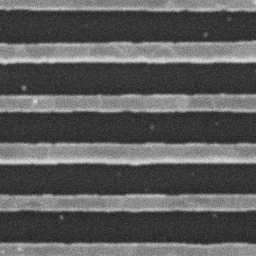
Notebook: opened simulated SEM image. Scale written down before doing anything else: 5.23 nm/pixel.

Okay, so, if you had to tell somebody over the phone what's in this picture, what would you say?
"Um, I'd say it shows lines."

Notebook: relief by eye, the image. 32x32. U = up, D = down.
UUUUUUUUUUUUUUUUUUUUUUUUUUUUUUUU
DDDDDDDDDDDDDDDDDDDDDDDDDDDDDDDD
DDDDDDDDDDDDDDDDDDDDDDDDDDDDDDDD
DDDDDDDDDDDDDDDDDDDDDDDDDDDDDDDD
DDDDDDDDDDDDDDDDDDDDDDDDDDDDDDDD
DDDDDDDDDDDDDUUUUUUUUUUUUUUUUUUU
UUUUUUUUUUUUUUUUUUUUUUUUUUUUUUUU
UUUUUUUUUUUUUUUUUUUUUUUUUUUUUUUU
DDDDDDDDDDDDDDDDDDDDDDDDDDDDDDDD
DDDDDDDDDDDDDDDDDDDDDDDDDDDDDDDD
DDDDDDDDDDDDDDDDDDDDDDDDDDDDDDDD
DDDDDDDDDDDDDDDDDDDDDDDDDDDDDDDD
UUUUUUUUUUUUUUUUUUUUUUUUUUUUUUUU
UUUUUUUUUUUUUUUUUUUUUUUUUUUUUUUU
DDDDDDDDDDDDDDDDDDDDDDDDDDDDDDDD
DDDDDDDDDDDDDDDDDDDDDDDDDDDDDDDD
DDDDDDDDDDDDDDDDDDDDDDDDDDDDDDDD
DDDDDDDDDDDDDDDDDDDDDDDDDDDDDDDD
UUUUUUUUUUUUUUUUUUUUUUUUUUUUUUUU
UUUUUUUUUUUUUUUUUUUUUUUUUUUUUUUU
DDDDDDDDDDDDDDDDDDDDDDDDDDDDDDDD
DDDDDDDDDDDDDDDDDDDDDDDDDDDDDDDD
DDDDDDDDDDDDDDDDDDDDDDDDDDDDDDDD
DDDDDDDDDDDDDDDDDDDDDDDDDDDDDDDD
UDDDDUUDDUUDDDDUUUUUUDUUUUUUUUUU
UUUUUUUUUUUUUUUUUUUUUUUUUUUUUUUU
DDDDDDDDDDDDDDDDDDDDDDDDDDDDDDDD
DDDDDDDDDDDDDDDDDDDDDDDDDDDDDDDD
DDDDDDDDDDDDDDDDDDDDDDDDDDDDDDDD
DDDDDDDDDDDDDDDDDDDDDDDDDDDDDDDD
UUUUUUUUDUUUUUUUUUUUUUUUDDDUUUUD
UUUUUUUUUUUUUUUUUUUUUUUUUUUUUUUU